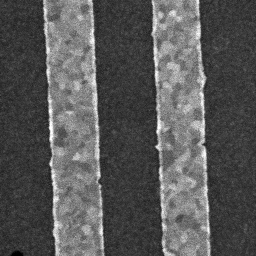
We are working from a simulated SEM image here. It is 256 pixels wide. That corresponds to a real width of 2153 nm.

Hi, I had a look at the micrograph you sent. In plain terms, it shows one or a few lines or trenches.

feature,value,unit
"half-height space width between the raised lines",506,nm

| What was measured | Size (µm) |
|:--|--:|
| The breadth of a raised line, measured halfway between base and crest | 0.394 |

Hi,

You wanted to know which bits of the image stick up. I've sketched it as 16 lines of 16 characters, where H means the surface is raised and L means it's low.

LLLHHHLLLLHHLLLL
LLLHHHLLLLHHLLLL
LLLHHHLLLLHHLLLL
LLLHHHLLLLHHHLLL
LLLHHHLLLLHHHLLL
LLLHHHLLLLHHHLLL
LLLHHHLLLLHHHLLL
LLLHHHLLLLHHHLLL
LLLHHHLLLLHHHLLL
LLLHHHLLLLHHHLLL
LLLHHHLLLLHHHLLL
LLLHHHLLLLHHHLLL
LLLHHHLLLLHHHLLL
LLLHHHLLLLHHHLLL
LLLHHHLLLLHHHLLL
LLLHHHLLLLHHHLLL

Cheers